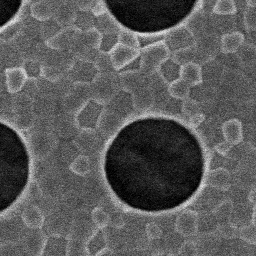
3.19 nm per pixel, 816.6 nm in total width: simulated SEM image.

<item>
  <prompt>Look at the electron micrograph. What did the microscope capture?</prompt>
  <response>holes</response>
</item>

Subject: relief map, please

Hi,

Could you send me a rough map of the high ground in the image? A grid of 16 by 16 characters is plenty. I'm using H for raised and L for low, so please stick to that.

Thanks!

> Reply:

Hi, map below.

LHHHHHHLLLLLHHHH
HHHHHHHHLLLHHHHH
HHHHHHHHHHHHHHHH
HHHHHHHHHHHHHHHH
HHHHHHHHHHHHHHHH
HHHHHHHHHHHHHHHH
HHHHHHHHHHHHHHHH
HHHHHHHHHLLHHHHH
LHHHHHHLLLLLHHHH
LLHHHHHLLLLLLHHH
LLHHHHHLLLLLLHHH
LLHHHHHLLLLLHHHH
LHHHHHHHLLLLHHHH
HHHHHHHHHHHHHHHH
HHHHHHHHHHHHHHHH
HHHHHHHHHHHHHHHH